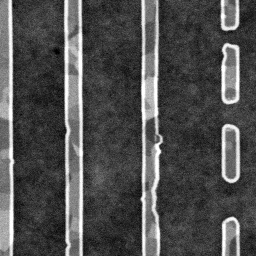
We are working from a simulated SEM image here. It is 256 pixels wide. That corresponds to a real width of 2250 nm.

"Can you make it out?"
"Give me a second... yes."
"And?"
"one or a few lines or trenches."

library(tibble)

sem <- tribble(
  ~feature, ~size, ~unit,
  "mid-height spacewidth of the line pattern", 0.551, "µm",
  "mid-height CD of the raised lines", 0.121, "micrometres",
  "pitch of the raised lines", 682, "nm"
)